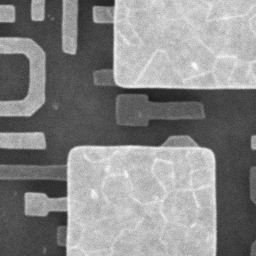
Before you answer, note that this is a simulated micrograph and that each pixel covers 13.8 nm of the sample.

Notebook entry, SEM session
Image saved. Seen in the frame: wiring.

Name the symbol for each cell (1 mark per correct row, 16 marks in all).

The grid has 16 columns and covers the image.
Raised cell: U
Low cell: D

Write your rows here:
DDDDDDDUUUUUUUUU
DDDDDDDUUUUUUUUU
DDDDDDDUUUUUUUUU
DDDDDDDUUUUUUUUU
DDDDDDDUUUUUUUUU
DDDDDDDDDDDDUUDD
DDDDDDDDDDDDDDDD
DDDDDDDDDDDDDDDD
DDDDDDDDDDDDDDDD
DDDDUUUUUUUUUDDD
DDDDUUUUUUUUUDDD
DDDDUUUUUUUUUDDD
DDDDUUUUUUUUUDDD
DDDDUUUUUUUUUDDD
DDDDUUUUUUUUUDDD
DDDDUUUUUUUUUDDD